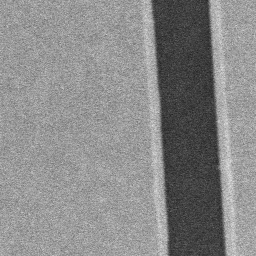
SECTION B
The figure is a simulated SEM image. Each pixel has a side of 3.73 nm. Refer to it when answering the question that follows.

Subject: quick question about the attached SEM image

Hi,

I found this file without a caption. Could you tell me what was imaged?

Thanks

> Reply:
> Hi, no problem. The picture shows one or a few lines or trenches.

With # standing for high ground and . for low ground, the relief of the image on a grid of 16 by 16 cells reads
#########....###
#########.....##
#########.....##
#########.....##
##########....##
##########....##
##########....##
##########....##
##########....##
##########....##
##########....##
##########....##
##########....##
##########....##
##########....##
##########....##